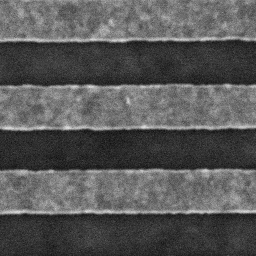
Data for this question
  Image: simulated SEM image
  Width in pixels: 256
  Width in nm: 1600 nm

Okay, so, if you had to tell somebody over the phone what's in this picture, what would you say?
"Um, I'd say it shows lines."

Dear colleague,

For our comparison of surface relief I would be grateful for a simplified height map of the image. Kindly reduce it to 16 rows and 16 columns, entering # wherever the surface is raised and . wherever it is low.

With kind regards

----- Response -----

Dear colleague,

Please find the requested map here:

################
################
#############..#
................
................
################
################
################
................
................
................
################
################
................
................
................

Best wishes